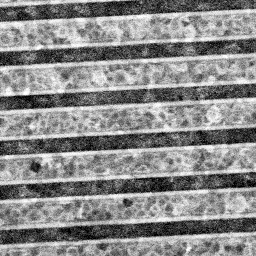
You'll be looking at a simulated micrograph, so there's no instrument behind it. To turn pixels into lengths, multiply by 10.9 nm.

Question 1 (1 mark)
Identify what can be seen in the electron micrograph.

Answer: parallel lines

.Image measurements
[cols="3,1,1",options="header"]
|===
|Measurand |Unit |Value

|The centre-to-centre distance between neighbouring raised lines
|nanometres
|485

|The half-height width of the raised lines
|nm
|282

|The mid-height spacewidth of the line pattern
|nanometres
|201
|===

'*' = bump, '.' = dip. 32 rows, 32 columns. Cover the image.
*...............................
..............................**
...........*********************
********************************
*******************************.
***********.....................
................................
......................**********
...*****************************
********************************
************************........
*****...........................
................................
..............******************
********************************
********************************
***************.................
................................
.........................*******
.....***************************
********************************
**************************......
*******.........................
................................
................****************
********************************
********************************
*******************.............
................................
.............................***
.........***********************
********************************